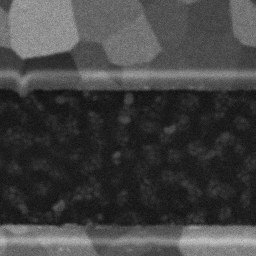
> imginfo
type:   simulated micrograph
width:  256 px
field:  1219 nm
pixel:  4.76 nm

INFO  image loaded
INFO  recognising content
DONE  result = one or a few lines or trenches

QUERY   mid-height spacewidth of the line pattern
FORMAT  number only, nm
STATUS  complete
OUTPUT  795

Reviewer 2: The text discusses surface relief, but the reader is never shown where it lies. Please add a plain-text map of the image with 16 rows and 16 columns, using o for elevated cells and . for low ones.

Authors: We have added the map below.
oooooooooooooooo
oooooooooooooooo
oooooooooooooooo
oooooooooooooooo
oooooooooooooooo
................
................
................
................
................
................
................
................
................
................
oooooooooooooooo